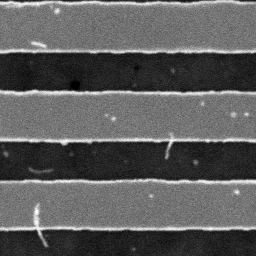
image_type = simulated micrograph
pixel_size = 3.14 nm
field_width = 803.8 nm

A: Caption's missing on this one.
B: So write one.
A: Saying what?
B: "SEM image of lines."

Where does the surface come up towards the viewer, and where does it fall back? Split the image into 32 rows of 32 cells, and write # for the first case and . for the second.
################################
################################
################################
################################
################################
################################
#.............##..#........###..
................................
................................
................................
................................
##.######....####.........####..
################################
################################
################################
################################
################################
################################
................................
................................
................................
................................
.................###............
################################
################################
################################
################################
################################
################################
................................
................................
................................